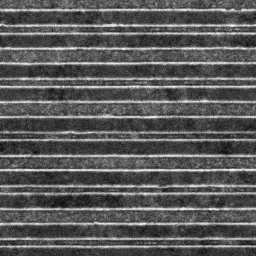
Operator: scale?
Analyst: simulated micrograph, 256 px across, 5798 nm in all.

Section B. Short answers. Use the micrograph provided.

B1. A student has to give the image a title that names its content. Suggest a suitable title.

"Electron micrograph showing parallel lines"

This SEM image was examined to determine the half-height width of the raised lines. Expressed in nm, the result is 354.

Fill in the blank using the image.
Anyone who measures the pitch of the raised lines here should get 604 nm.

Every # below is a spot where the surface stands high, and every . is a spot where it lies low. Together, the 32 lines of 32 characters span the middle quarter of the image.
################################
################################
################################
################################
................................
................................
################################
################################
################################
................................
................................
................................
................................
################################
################################
################################
################################
................................
................................
################################
################################
################################
################################
................................
................................
................................
................................
################################
################################
################################
################################
................................